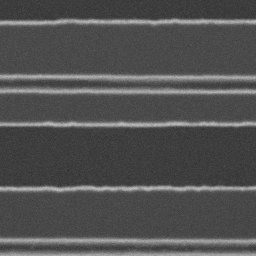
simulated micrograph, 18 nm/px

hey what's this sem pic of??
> lines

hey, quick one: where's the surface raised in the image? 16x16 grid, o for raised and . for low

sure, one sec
................
oooooooooooooooo
oooooooooooooooo
oooooooooooooooo
oooooooooooooooo
oooooooooooooooo
oooooooooooooooo
oooooooooooooooo
................
................
................
................
oooooooooooooooo
oooooooooooooooo
oooooooooooooooo
oooooooooooooooo